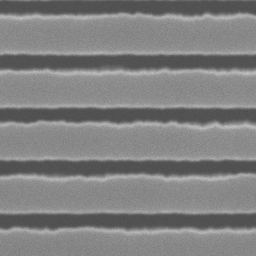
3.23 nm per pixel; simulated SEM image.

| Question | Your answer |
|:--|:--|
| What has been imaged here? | lines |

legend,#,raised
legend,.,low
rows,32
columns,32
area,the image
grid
................................
................................
################################
################################
################################
################################
################################
................................
................................
################################
################################
################################
################################
................................
................................
##############.#########..##.##.
################################
################################
################################
################################
................................
................................
################################
################################
################################
################################
################################
................................
..#.......##....................
################################
################################
################################